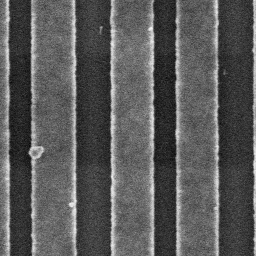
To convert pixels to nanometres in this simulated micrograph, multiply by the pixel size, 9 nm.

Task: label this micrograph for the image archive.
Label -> lines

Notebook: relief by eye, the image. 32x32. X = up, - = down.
X---XXXXX-----XXXXX---XXXXX-----
X---XXXXX-----XXXXX---XXXXX-----
X---XXXXX-----XXXXX---XXXXX-----
X---XXXXX-----XXXXX---XXXXX-----
X---XXXXX-----XXXXX---XXXXX-----
X---XXXXX-----XXXXX---XXXXX-----
X---XXXXX-----XXXXX---XXXXX-----
X---XXXXX-----XXXXX---XXXXX-----
X---XXXXX-----XXXXX---XXXXX-----
X---XXXXX-----XXXXX---XXXXX-----
X---XXXXX-----XXXXX---XXXXX-----
X---XXXXX-----XXXXX---XXXXX-----
X---XXXXX-----XXXXX---XXXXX-----
X---XXXXX-----XXXXX---XXXXX-----
X---XXXXX-----XXXXX---XXXXX-----
X---XXXXX-----XXXXX---XXXXX-----
X---XXXXX-----XXXXX---XXXXX-----
X---XXXXX-----XXXXX---XXXXX-----
X---XXXXX-----XXXXX---XXXXX-----
X---XXXXX-----XXXXX---XXXXX-----
X---XXXXX-----XXXXX---XXXXX-----
X---XXXXX-----XXXXX---XXXXX-----
X---XXXXX-----XXXXX---XXXXX-----
X---XXXXX-----XXXXX---XXXXX-----
X---XXXXX-----XXXXX---XXXXX-----
X---XXXXX-----XXXXX---XXXXX-----
X---XXXXX-----XXXXX---XXXXX-----
X---XXXXX-----XXXXX---XXXXX-----
X---XXXXX-----XXXXX---XXXXX-----
X---XXXXX-----XXXXX---XXXXX-----
X---XXXXX-----XXXXX---XXXXX-----
X---XXXXXX----XXXXX---XXXXX-----